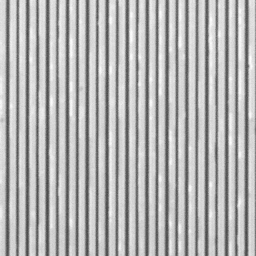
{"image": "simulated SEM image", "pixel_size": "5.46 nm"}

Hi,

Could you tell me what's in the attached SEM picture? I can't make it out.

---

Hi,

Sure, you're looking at parallel lines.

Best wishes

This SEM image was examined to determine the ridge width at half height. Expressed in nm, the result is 35.5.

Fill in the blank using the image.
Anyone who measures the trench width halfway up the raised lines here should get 20.5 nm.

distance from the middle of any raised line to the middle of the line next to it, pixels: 9.95